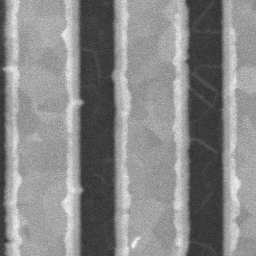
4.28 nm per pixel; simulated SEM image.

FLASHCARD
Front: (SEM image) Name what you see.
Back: one or a few lines or trenches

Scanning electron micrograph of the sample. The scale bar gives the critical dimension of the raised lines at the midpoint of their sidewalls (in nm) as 270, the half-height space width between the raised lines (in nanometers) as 197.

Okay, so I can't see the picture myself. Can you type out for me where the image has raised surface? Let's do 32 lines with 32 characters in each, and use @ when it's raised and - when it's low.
-@@@@@@@@------@@@@@@@@------@@@
-@@@@@@@@------@@@@@@@@------@@@
-@@@@@@@@------@@@@@@@@------@@@
-@@@@@@@@------@@@@@@@@------@@@
-@@@@@@@@------@@@@@@@@------@@@
-@@@@@@@@------@@@@@@@@------@@@
--@@@@@@@------@@@@@@@@------@@@
-@@@@@@@@------@@@@@@@@------@@@
-@@@@@@@@------@@@@@@@@------@@@
-@@@@@@@@------@@@@@@@@------@@@
-@@@@@@@@------@@@@@@@@------@@@
-@@@@@@@@------@@@@@@@@------@@@
-@@@@@@@@------@@@@@@@@------@@@
--@@@@@@@------@@@@@@@@------@@@
-@@@@@@@@------@@@@@@@@------@@@
-@@@@@@@@------@@@@@@@@------@@@
-@@@@@@@@------@@@@@@@@------@@@
-@@@@@@@@------@@@@@@@@------@@@
-@@@@@@@@------@@@@@@@@------@@@
-@@@@@@@@------@@@@@@@@------@@@
-@@@@@@@@------@@@@@@@@------@@@
-@@@@@@@@------@@@@@@@@------@@@
-@@@@@@@@------@@@@@@@@------@@@
-@@@@@@@@------@@@@@@@@------@@@
-@@@@@@@@------@@@@@@@@------@@@
-@@@@@@@@------@@@@@@@@------@@@
-@@@@@@@@------@@@@@@@@------@@@
-@@@@@@@@------@@@@@@@@------@@@
-@@@@@@@@------@@@@@@@@------@@@
-@@@@@@@@------@@@@@@@@------@@@
--@@@@@@@------@@@@@@@@------@@@
-@@@@@@@@------@@@@@@@@------@@@